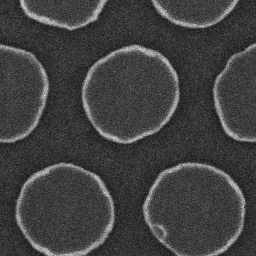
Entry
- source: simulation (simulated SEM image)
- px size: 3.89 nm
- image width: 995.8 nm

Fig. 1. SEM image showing raised bodies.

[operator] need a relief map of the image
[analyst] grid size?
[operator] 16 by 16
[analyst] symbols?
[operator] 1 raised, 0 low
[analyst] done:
0111110000111100
0001100000011000
0000000000000000
1100000111000001
1110001111100011
1110011111100111
1110011111100011
1100001111000011
1000000110000011
0000000000000000
0001100000011000
0011110000111110
0111111001111110
0111111001111110
0111111000111110
0011110000011100